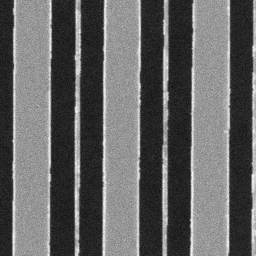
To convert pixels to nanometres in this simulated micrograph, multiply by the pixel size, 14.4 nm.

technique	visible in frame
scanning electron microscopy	lines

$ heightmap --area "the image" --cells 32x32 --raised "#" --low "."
..####.......####.......#####...
..####.......####.......#####...
..####.......####.......#####...
..####.......####.......#####...
..####.......####.......#####...
..####.......####.......#####...
..####.......####.......#####...
..####.......####.......#####...
..####.......####.......#####...
..####.......####.......#####...
..####.......####.......#####...
..####.......####.......#####...
..####.......####.......#####...
..####.......####.......#####...
..####.......####.......#####...
..####.......####.......#####...
..####.......####.......#####...
..####.......####.......#####...
..####.......####.......#####...
..####.......####.......#####...
..####.......####.......#####...
..####.......####.......#####...
..####.......####.......#####...
..####.......####.......#####...
..####.......####.......#####...
..####.......####.......#####...
..####.......####.......#####...
..####.......####.......#####...
..####.......####.......#####...
..####.......####.......####....
..####.......####.......####....
..####.......####.......####....